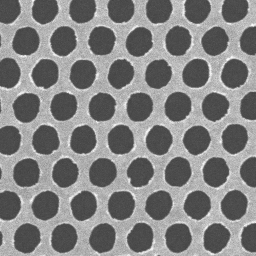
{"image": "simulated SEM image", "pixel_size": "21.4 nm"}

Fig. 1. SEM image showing a regular array of holes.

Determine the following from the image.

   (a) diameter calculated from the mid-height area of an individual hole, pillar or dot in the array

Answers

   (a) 607 nanometres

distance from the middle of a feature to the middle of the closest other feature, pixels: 37.4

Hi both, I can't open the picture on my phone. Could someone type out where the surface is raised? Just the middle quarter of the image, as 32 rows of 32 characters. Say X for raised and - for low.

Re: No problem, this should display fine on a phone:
XX------XXXX-----XXXX-----XXXX--
X-------XXX-------XX-------XXX--
XX------XXX-------XX-------XX---
X-------XXX------XXX-------XX---
XX-----XXXX------XXX------XXXX--
XXX----XXXXX----XXXXX----XXXXXX-
XXXXXXXXXXXXXXXXXXXXXXXXXXXXXXXX
--XXXXXX---XXXXXX----XXXXXX---XX
---XXXX------XXX------XXXX-----X
---XXX-------XXX------XXX-------
---XXX-------XXX------XXX-------
---XXX-------XXX------XXX-------
---XXX-------XXX------XXX------X
--XXXXX-----XXXX-----XXXXX----XX
XXXXXXXXXXXXXXXXXX--XXXXXXX--XXX
XXXX--XXXXXXX---XXXXXX---XXXXXXX
XX-----XXXXX-----XXXXX----XXXXX-
XX------XXX------XXXX------XXX--
XX------XXX-------XX-------XXX--
XX------XXX-------XX-------XXX--
XX------XXX------XXX-------XXX--
XX-----XXXXX-----XXXX-----XXXXX-
XXXXXXXXXXXXX--XXXXXXXX--XXXXXXX
-XXXXXXXX-XXXXXXXXX-XXXXXXX---XX
---XXXX-----XXXXX-----XXXX-----X
---XXXX------XXX------XXXX------
----XX-------XXX-------XX-------
----XX-------XXX-------XX-------
---XXX-------XXX------XXX-------
---XXXX-----XXXX-----XXXXX-----X
-XXXXXXX---XXXXXX---XXXXXXX---XX
XXXXXXXXXXXXXXXXXXXXXXXXXXXXXXXX